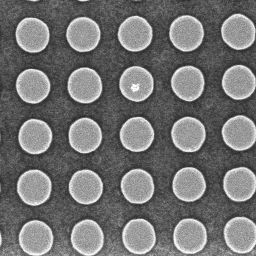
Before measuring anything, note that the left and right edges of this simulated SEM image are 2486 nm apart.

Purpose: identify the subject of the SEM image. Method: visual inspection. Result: a regular array of raised bodies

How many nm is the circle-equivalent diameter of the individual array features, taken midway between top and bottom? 332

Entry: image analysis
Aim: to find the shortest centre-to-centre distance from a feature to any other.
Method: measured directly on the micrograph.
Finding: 488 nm